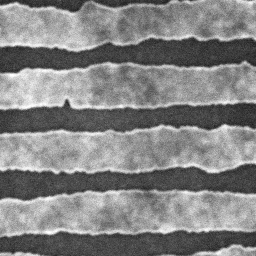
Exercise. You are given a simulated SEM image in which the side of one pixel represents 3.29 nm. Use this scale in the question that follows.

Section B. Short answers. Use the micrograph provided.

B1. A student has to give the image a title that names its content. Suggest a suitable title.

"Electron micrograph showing one or a few lines or trenches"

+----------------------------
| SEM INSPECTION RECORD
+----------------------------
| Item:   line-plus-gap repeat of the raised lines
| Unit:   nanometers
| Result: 207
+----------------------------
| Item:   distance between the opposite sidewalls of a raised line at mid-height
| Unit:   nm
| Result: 121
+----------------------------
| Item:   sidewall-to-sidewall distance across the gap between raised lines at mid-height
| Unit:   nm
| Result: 82.6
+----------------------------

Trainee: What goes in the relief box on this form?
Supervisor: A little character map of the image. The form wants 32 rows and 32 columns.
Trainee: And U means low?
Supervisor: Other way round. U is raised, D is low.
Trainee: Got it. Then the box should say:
DDDDDDDDDDDUDDDDDDDDDUUUUUUUUUUU
UUUUUUUUDDUUUUUUUUUUUUUUUUUUUUUU
UUUUUUUUUUUUUUUUUUUUUUUUUUUUUUUU
UUUUUUUUUUUUUUUUUUUUUUUUUUUUUUUU
UUUUUUUUUUUUUUUUUUUUUUUUUUUUUUUU
UUUUUUUUUUUUUDDUDDDDDDDDDDDDDDDD
DDDDDDDDDDDDDDDDDDDDDDDDDDDDDDDD
DDDDDDDDDDDDDDDDDDDDDDDDDDDDDDDD
DDDDDDDDDDDUUUUUUUUUUUDDDDDUUUUU
UUUUUUUUUUUUUUUUUUUUUUUUUUUUUUUU
UUUUUUUUUUUUUUUUUUUUUUUUUUUUUUUU
UUUUUUUUUUUUUUUUUUUUUUUUUUUUUUUU
UUUUUUUUDUUUUUUUUUUUUUUUUUUUUUUU
UDDDDDDDDDDDDUDDDDDDDDDDDDDDDDDD
DDDDDDDDDDDDDDDDDDDDDDDDDDDDDDDD
DDDDDDDDDDDDDDDDDDDDDDDDDDDDDDDD
DDDDDDDUDDDDDUDDUUUUUUUUUUUUUUUU
UUUUUUUUUUUUUUUUUUUUUUUUUUUUUUUU
UUUUUUUUUUUUUUUUUUUUUUUUUUUUUUUU
UUUUUUUUUUUUUUUUUUUUUUUUUUUUUUUU
UUUUUUUUUUUUUUUUUUUUUUUUUUUUUUDD
DDDDDDDDDDDDDDDDDDDDDDDDDDDDDDDD
DDDDDDDDDDDDDDDDDDDDDDDDDDDDDDDD
DDDDDDDDDDDDDDDDDDDDDDDDDDDDDDDD
DDDDDDDDUUUUUUUUUUUUUUUUUUUUUUUU
UUUUUUUUUUUUUUUUUUUUUUUUUUUUUUUU
UUUUUUUUUUUUUUUUUUUUUUUUUUUUUUUU
UUUUUUUUUUUUUUUUUUUUUUUUUUUUUUUU
UUUUUUUUUUUUUUUUUUUUUUUUUUUUUUUU
DDDDDDDDDDDDDDDDDDDDDDDDDDDDDDDD
DDDDDDDDDDDDDDDDDDDDDDDDDDDDDDDD
DDDDDDDDDDDDDDDDDDDDDDDDDDDUUUUU